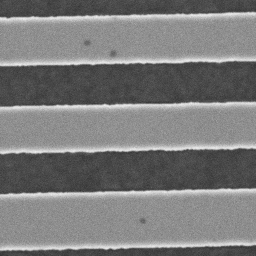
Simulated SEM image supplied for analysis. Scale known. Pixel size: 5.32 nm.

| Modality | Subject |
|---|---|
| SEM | lines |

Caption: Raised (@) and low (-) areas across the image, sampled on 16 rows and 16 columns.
----------------
@@@@@@@@@@@@@@@@
@@@@@@@@@@@@@@@@
@@@@@@@@@@@@@@@@
----------------
----------------
----------@@@@@@
@@@@@@@@@@@@@@@@
@@@@@@@@@@@@@@@@
@@@@@@----------
----------------
----------------
@@@@@@@@@@@@@@@@
@@@@@@@@@@@@@@@@
@@@@@@@@@@@@@@@@
@@@@@@@@@-------